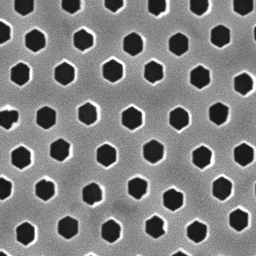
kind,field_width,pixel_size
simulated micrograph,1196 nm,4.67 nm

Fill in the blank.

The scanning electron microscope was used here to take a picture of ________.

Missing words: a regular array of holes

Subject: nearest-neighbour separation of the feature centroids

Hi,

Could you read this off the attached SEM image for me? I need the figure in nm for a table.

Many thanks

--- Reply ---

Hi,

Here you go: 181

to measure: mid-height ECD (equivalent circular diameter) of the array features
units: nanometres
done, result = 98.5